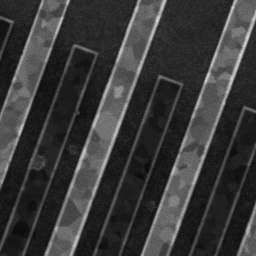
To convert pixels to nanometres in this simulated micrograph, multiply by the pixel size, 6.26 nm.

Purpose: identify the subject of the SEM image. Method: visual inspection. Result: parallel lines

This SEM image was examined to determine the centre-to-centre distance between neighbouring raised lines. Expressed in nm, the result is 283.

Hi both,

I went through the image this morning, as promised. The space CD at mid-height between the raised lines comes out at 129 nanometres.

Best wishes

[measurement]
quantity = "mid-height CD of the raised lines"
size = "153 nanometers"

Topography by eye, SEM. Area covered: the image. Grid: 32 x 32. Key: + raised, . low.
.....+++.........+++.........+++
.....+++.........+++.........+++
+...++++........++++.........+++
+...+++.........+++.........+++.
+...+++.........+++.........+++.
+..++++........++++........++++.
...+++...+++...+++.........+++..
...+++...+++...+++.........+++..
..+++...++++..++++........++++..
..+++...+++...+++.........+++...
..+++...+++...+++...++....+++...
.+++...+++...+++...+++...+++....
.+++...+++...+++...+++...+++....
++++..++++..++++..++++..++++....
+++...+++...+++...+++...+++...++
+++...+++...+++...+++...+++...++
+++..++++..++++..++++..++++..+++
++...+++...+++...+++...+++...+++
++...+++...+++...+++...+++...+++
+...+++...+++...++++..++++..++++
+...+++...+++...+++...+++...+++.
+...+++...+++...+++...+++...+++.
...+++...+++...+++...+++...+++..
...+++...+++...+++...+++...+++..
..++++..++++..++++..++++..++++..
..+++...+++...+++...+++...+++...
..+++...+++...+++...+++...+++...
.++++..++++..++++..++++..++++..+
.+++...+++...+++...+++...+++...+
.+++...+++...+++...+++...+++...+
+++...+++...+++...+++...++++..++
+++...+++...+++...+++...+++...++